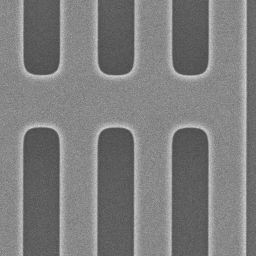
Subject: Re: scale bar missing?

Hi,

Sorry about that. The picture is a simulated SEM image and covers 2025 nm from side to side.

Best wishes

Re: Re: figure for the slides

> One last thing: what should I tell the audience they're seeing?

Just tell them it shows groups of lines, slits or small figures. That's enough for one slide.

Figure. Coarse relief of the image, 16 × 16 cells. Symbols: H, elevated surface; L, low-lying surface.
HLLLHHLLHHHLLHHL
HLLLHHLLHHHLLHHL
HLLLHHLLHHHLLHHL
HLLLHHLLHHHLLHHL
HHLHHHHLHHHLLHHL
HHHHHHHHHHHHHHHL
HHHHHHHHHHHHHHHL
HHHHHHHHHHHHHHHL
HHLLHHLLHHHLLHHL
HLLLHHLLHHHLLHHL
HLLLHHLLHHHLLHHL
HLLLHHLLHHHLLHHL
HLLLHHLLHHHLLHHL
HLLLHHLLHHHLLHHL
HLLLHHLLHHHLLHHL
HLLLHHLLHHHLLHHL